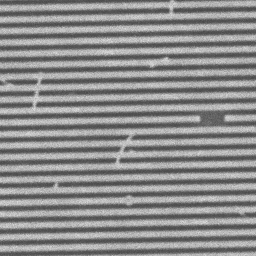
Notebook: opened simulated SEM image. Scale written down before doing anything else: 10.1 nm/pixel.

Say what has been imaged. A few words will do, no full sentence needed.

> parallel lines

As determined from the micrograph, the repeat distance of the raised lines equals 116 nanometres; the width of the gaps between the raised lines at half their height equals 54.4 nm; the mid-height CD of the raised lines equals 63.3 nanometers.